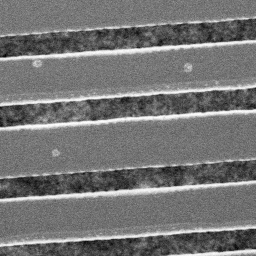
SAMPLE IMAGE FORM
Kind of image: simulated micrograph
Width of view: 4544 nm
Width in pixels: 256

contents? lines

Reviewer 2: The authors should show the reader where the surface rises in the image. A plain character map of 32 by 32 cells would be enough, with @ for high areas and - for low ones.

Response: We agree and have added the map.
@@@@@@@@@@@@@@@@@@@@@@@@@@@@@@@@
@@@@@@@@@@@@@@@@@@@@@@@@@@@@@@@@
@@@@@@@@@@@@@@@@@@@@@@@@@@@@@---
@@@@@@@@@@@@@-------------------
@-------------------------------
--------------------------@@@@@@
-------------@@@@@@@@@@@@@@@@@@@
@@@@@@@@@@@@@@@@@@@@@@@@@@@@@@@@
@@@@@@@@@@@@@@@@@@@@@@@@@@@@@@@@
@@@@@@@@@@@@@@@@@@@@@@@@@@@@@@@@
@@@@@@@@@@@@@@@@@@@@@@@@@@@@@@@@
@@@@@@@@@@@@@@@@@@@@@@@---------
@@@@@@@@@@----------------------
--------------------------------
----------------------@@@@@@@@@@
--------@@@@@@@@@@@@@@@@@@@@@@@@
@@@@@@@@@@@@@@@@@@@@@@@@@@@@@@@@
@@@@@@@@@@@@@@@@@@@@@@@@@@@@@@@@
@@@@@@@@@@@@@@@@@@@@@@@@@@@@@@@@
@@@@@@@@@@@@@@@@@@@@@@@@@@@@@@@@
@@@@@@@@@@@@@@@@@@@@@@@@--------
@@@@@@@@@@@---------------------
--------------------------------
----------------------@@@@@@@@@@
-------@@@@@@@@@@@@@@@@@@@@@@@@@
@@@@@@@@@@@@@@@@@@@@@@@@@@@@@@@@
@@@@@@@@@@@@@@@@@@@@@@@@@@@@@@@@
@@@@@@@@@@@@@@@@@@@@@@@@@@@@@@@@
@@@@@@@@@@@@@@@@@@@@@@@@@@@@@@@-
@@@@@@@@@@@@@@@@@@@-------------
@@------------------------------
-----------------------------@@@